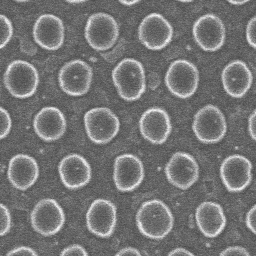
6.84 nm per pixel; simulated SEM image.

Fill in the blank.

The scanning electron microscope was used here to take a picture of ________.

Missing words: a regular array of raised bodies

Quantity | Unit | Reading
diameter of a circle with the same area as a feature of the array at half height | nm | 223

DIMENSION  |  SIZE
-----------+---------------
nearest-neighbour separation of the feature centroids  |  0.358 micrometres